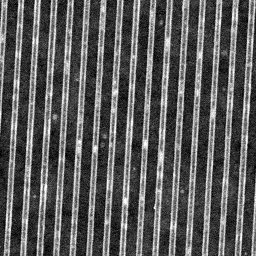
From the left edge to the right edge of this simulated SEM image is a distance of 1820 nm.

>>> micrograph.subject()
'parallel lines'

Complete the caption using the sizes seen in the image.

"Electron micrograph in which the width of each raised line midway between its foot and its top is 5.25 pixels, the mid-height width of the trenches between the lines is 79 nanometers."